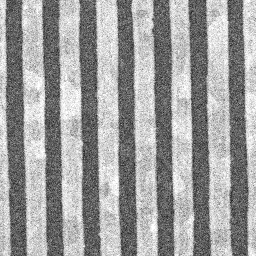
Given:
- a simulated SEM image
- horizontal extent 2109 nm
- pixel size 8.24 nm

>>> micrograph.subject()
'parallel lines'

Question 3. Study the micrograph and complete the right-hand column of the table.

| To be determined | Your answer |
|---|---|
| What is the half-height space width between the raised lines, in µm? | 0.165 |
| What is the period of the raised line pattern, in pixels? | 36.9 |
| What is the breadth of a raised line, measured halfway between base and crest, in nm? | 140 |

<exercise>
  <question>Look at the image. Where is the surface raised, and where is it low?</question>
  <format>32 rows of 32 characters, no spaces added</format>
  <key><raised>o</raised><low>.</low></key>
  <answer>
...oo...oo..oo...oo..oo...oo...o
...oo...oo..oo...oo...o...oo...o
...oo...oo..oo...oo...o...oo...o
...oo...oo..oo...oo...o...oo...o
...oo...oo..oo...oo...o...oo...o
...oo...oo..oo...oo...o...oo...o
...oo...oo..oo...oo...o...oo...o
...oo...oo..oo...oo...oo..oo...o
o..oo...oo..oo...oo...oo..oo...o
o..oo...oo..ooo..oo...oo..oo...o
o..oo...oo..oo...oo...oo..oo...o
...oo...oo..oo...oo...oo..oo...o
...oo...oo..oo...oo...oo..oo...o
...oo...oo..oo...oo...oo..oo...o
o..oo...oo..ooo..oo...oo..oo...o
o..oo...oo...oo..oo...oo..oo...o
o..oo...oo...oo..oo...oo..oo...o
o..oo...oo...oo..oo...oo..oo...o
o..oo...oo...oo..oo...oo..oo...o
o..oo...oo...o...oo...oo..oo...o
o..oo...oo...o...oo...oo..oo...o
o..ooo..oo...oo..oo...oo..ooo..o
o...oo..oo...oo..oo...oo..ooo..o
o...o...oo...oo..oo...oo..ooo..o
o...o...oo...oo..oo...oo..ooo..o
o...o...oo...oo..oo...oo..ooo..o
o...o...oo...oo..oo...oo..oo...o
o...o...oo...oo..oo...oo..oo...o
o...oo..oo...oo..oo...oo..ooo..o
o...oo..oo...oo..oo...oo...oo..o
o...oo..oo...oo..oo...oo...oo..o
o...oo..oo...oo..oo...oo...oo..o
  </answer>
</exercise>